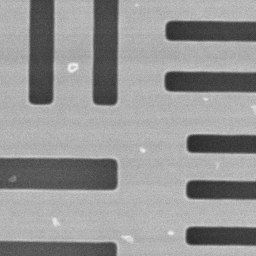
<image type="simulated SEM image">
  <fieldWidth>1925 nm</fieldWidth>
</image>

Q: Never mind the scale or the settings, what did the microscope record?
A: groups of lines, slits or small figures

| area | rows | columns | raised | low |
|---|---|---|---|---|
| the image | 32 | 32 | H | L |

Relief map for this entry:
HHHHLLLHHHHHLLLHHHHHHHHHHHHHHHHH
HHHHLLLHHHHHLLLHHHHHHHHHHHHHHHHH
HHHHLLLHHHHHLLLHHHHHHHHHHHHHHHHH
HHHHLLLHHHHHLLLHHHHHHLLLLLLLLLLL
HHHHLLLHHHHHLLLHHHHHHLLLLLLLLLLL
HHHHLLLHHHHHLLLHHHHHHHHHHHHHHHHH
HHHHLLLHHHHHLLLHHHHHHHHHHHHHHHHH
HHHHLLLHHHHHLLLHHHHHHHHHHHHHHHHH
HHHHLLLHHHHHLLLHHHHHHHHHHHHHHHHH
HHHHLLLHHHHLLLLHHHHHHLLLLLLLLLLL
HHHHLLLHHHHLLLLHHHHHHLLLLLLLLLLL
HHHHLLLHHHHLLLLHHHHHHLLLLLLLLLLL
HHHHLLLHHHHHLLLHHHHHHHHHHHHHHHHH
HHHHHHHHHHHHHHHHHHHHHHHHHHHHHHHH
HHHHHHHHHHHHHHHHHHHHHHHHHHHHHHHH
HHHHHHHHHHHHHHHHHHHHHHHHHHHHHHHH
HHHHHHHHHHHHHHHHHHHHHHHHHHHHHHHH
HHHHHHHHHHHHHHHHHHHHHHHLLLLLLLLL
HHHHHHHHHHHHHHHHHHHHHHHLLLLLLLLL
HHHHHHHHHHHHHHHHHHHHHHHHHHHHHHHH
LLLLLLLLLLLLLLLHHHHHHHHHHHHHHHHH
LLLLLLLLLLLLLLLHHHHHHHHHHHHHHHHH
LLLLLLLLLLLLLLLHHHHHHHHHLLHHHHHH
LLLLLLLLLLLLLLLHHHHHHHHLLLLLLLLL
HHHHHHHHHHHHHHHHHHHHHHHLLLLLLLLL
HHHHHHHHHHHHHHHHHHHHHHHHHHHHHHHH
HHHHHHHHHHHHHHHHHHHHHHHHHHHHHHHH
HHHHHHHHHHHHHHHHHHHHHHHHHHHHHHHH
HHHHHHHHHHHHHHHHHHHHHHHHLLLLLLLL
HHHHHHHHHHHHHHHHHHHHHHHLLLLLLLLL
LLLLLLLLLLLLLLHHHHHHHHHHLLLLLLLL
LLLLLLLLLLLLLLLHHHHHHHHHHHHHHHHH